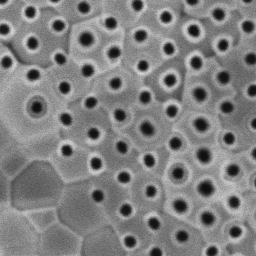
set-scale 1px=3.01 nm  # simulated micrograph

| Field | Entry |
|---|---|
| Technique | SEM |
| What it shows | a regular array of holes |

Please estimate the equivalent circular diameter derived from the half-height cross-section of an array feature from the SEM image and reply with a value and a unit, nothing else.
36 nanometers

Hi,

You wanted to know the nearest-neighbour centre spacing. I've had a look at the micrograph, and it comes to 90.3 nanometres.